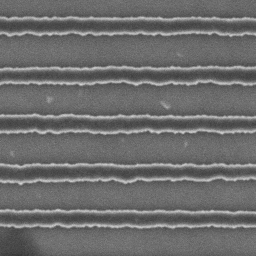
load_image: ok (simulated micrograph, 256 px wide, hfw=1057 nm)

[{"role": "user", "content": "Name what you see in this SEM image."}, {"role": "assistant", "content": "lines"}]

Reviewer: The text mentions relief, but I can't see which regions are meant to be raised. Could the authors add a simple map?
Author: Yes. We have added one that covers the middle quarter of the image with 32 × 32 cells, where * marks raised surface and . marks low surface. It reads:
................................
********************************
********************************
********************************
**************.*****************
................................
................................
................................
................................
................................
................................
................................
................................
********************************
********************************
********************************
********************************
..........*.....................
................................
................................
................................
................................
................................
................................
................................
********************************
********************************
********************************
********************************
...............**...............
................................
................................